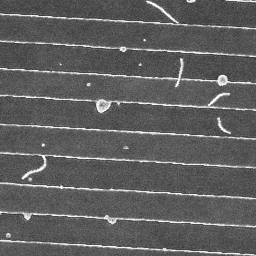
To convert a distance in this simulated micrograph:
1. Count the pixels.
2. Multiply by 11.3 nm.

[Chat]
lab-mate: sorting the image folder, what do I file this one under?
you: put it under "lines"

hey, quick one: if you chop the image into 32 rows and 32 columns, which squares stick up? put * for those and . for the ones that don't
................................
................................
*************...................
******************************..
********************************
......**************************
......................**********
................................
................................
****************................
********************************
********************************
..........**********************
............*...............****
................................
................................
*****************...............
********************************
********************************
.....***************************
......................**********
................................
................................
**********......................
***************************.....
********************************
********************************
..............*...**************
................................
................................
*******.........................
**************************......